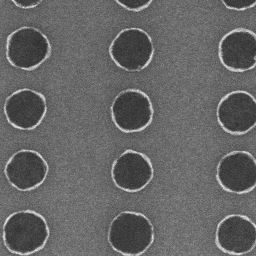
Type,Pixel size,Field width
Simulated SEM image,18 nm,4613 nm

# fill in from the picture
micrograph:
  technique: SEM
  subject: raised bodies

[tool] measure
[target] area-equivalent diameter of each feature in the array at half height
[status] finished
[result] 0.738 microns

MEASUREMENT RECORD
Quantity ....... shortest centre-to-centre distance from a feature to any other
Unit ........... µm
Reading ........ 1.1